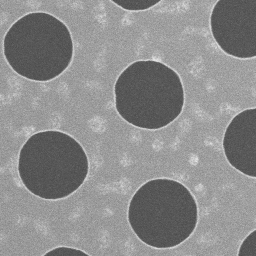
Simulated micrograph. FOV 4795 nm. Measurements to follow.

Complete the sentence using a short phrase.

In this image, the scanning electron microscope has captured holes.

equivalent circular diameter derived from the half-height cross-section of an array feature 1290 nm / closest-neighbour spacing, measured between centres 2230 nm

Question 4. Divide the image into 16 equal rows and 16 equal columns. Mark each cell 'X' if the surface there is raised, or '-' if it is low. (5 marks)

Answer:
XXXXXXXX-XXXX---
X---XXXXXXXXX---
----XXXXXXXXX---
----XXXXXXXXXXX-
X---XXXX---XXXXX
XXXXXXX----XXXXX
XXXXXXX----XXXXX
XXXXXXXX---XXXX-
XX--XXXXXXXXXX--
X----XXXXXXXXX--
X----XXXXXXXXXX-
XX---XXXX--XXXXX
XXXXXXXX----XXXX
XXXXXXXX----XXXX
XXXXXXXX----XXXX
XXXXXXXXXXXXXXX-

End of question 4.